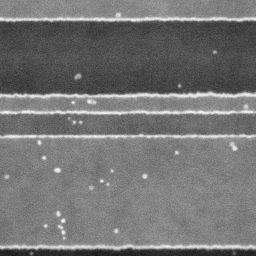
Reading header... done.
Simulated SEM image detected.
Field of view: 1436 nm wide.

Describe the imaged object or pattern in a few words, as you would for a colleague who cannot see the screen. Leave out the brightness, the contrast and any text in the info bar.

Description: lines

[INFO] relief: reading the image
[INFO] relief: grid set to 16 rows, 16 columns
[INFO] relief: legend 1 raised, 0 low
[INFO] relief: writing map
1111111111111111
0000000000000000
0000000000000000
0000000000000000
0000000000000000
0000000000000000
1111111111111111
1111111111111111
1111111111111111
1111111111111111
1111111111111111
1111111111111111
1111111111111111
1111111111111111
1111111111111111
0000000000000000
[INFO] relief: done